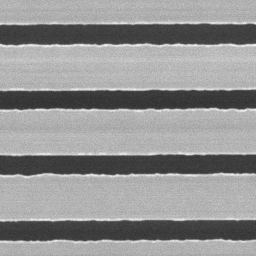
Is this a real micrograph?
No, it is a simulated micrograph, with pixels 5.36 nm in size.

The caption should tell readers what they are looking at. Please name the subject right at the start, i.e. lines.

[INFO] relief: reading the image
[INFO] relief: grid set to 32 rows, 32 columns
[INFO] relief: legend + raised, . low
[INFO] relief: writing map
++++++++++++++++++++++++++++++++
++++++++++++++++++++++++++++++++
++++++++++++++++++++++++++++++++
................................
................................
..................+...+.....+...
++++++++++++++++++++++++++++++++
++++++++++++++++++++++++++++++++
++++++++++++++++++++++++++++++++
++++++++++++++++++++++++++++++++
++++++++++++++++++++++++++++++++
................................
................................
................................
++++++++++++++++++++++++++++++++
++++++++++++++++++++++++++++++++
++++++++++++++++++++++++++++++++
++++++++++++++++++++++++++++++++
++++++++++++++++++++++++++++++++
................................
................................
................................
++++++++++++++++++++++++++++++++
++++++++++++++++++++++++++++++++
++++++++++++++++++++++++++++++++
++++++++++++++++++++++++++++++++
++++++++++++++++++++++++++++++++
++++++++++++++++++...++++....+..
................................
................................
++++++++++++++++++++++++++++++++
++++++++++++++++++++++++++++++++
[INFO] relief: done